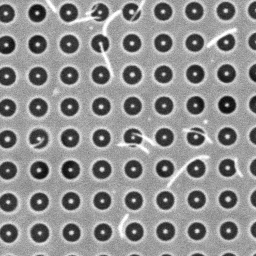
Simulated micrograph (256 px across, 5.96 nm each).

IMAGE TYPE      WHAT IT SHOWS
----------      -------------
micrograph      an array of small figures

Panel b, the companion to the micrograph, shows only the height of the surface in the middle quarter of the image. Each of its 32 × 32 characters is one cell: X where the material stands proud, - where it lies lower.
XXXXXXXXX-XXXXXX--XXXXXX--XXXXX-
---XXXX----XXXX----XXXX----XXXX-
----XXX----XXX------XX-----XXX--
----XXX----XXXX-----XX-----XXXX-
---XXXX----XXXX----XXXX----XXXX-
XXXXXXXXXXXXXXXXXXXXXXXXXXXXXXXX
XXXXXXXXXXXXXXXXXXXXXXXXXXXXXXXX
XXXXXXXXXXXXXXXXXXXXXXXXXXXXXXXX
--XXXXXX--XXXXXX---XXXX---XXXXXX
---XXXX----XXXX----XXXX----XXXX-
----XXX-----XXX-----XXX-----XX--
----XXX-----XXX----XXXX----XXXX-
---XXXXX---XXXXX---XXXXX--XXXXXX
XXXXXXXXXXXXXXXXXXXXXXXXXXXXXXXX
XXXXXXXXXXXXXXXXXXXXXXXXXXXXXXXX
XXXXXXXXXXXXXXXXXXXXXXXXXXXXXXXX
---XXXXX---XXXXX---XXXXX---XXXXX
----XXX-----XXX----XXXX----XXXX-
----XXX--X--XXX-----XXX-----XXX-
----XXX----XXXX-----XXX----XXXX-
---XXXXX---XXXXXX-XXXXXX--XXXXXX
XXXXXXXXXXXXXXXXXXXXXXXXXXXXXXXX
XXXXXXXXXXXXXXXXXXXXXXXXXXXXXXXX
XXXXXXXXXXXXXXXXXXXXXXXXXXXXXXXX
---XXXXX---XXXXX---XXXX----XXXXX
----XXX-----XXX-----XXX----XXXX-
----XXX--X--XXX--X--XXX-----XXX-
----XXX-----XXX----XXXX----XXXX-
---XXXXX---XXXXX---XXXXXXXXXXXXX
XXXXXXXXXXXXXXXXXXXXXXXXXXXXXXXX
XXXXXXXXXXXXXXXXXXXXXXXXXXXXXXXX
XXXXXXXXXXXXXXXXXXXXXXXXXXXXXXXX